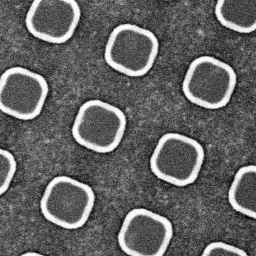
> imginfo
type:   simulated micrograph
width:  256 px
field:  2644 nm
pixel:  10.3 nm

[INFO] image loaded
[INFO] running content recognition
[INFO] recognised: raised bodies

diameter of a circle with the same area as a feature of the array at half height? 489 nm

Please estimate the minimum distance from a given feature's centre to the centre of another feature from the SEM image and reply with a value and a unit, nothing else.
858 nm